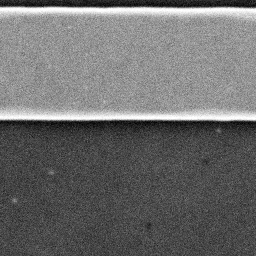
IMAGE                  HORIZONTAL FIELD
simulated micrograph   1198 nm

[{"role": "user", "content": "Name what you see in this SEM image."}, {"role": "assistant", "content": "wiring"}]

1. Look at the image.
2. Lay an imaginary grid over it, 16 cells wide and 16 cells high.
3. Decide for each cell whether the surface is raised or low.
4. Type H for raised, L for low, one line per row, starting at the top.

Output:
LLLLLLLLLLLLLLLL
HHHHHHHHHHHHHHHH
HHHHHHHHHHHHHHHH
HHHHHHHHHHHHHHHH
HHHHHHHHHHHHHHHH
HHHHHHHHHHHHHHHH
HHHHHHHHHHHHHHHH
LLLLLLLLLLLLLLLL
LLLLLLLLLLLLLLLL
LLLLLLLLLLLLLLLL
LLLLLLLLLLLLLLLL
LLLLLLLLLLLLLLLL
LLLLLLLLLLLLLLLL
LLLLLLLLLLLLLLLL
LLLLLLLLLLLLLLLL
LLLLLLLLLLLLLLLL